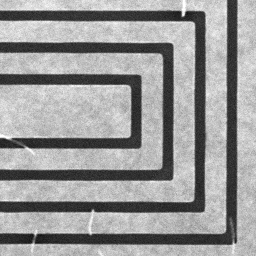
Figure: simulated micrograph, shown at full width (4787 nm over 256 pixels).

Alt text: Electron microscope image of groups of lines, slits or small figures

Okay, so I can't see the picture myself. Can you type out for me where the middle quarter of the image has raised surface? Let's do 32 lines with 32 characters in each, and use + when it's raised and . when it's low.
+++++++++++++++++++++++++...++++
+++++++++++++++++++++++++...++++
..................+++++++...++++
...................++++++...++++
....................+++++...++++
++++++++++++++++....+++++...++++
+++++++++++++++++...+++++...++++
+++++++++++++++++...+++++...++++
+++++++++++++++++...+++++...++++
+++++++++++++++++...+++++...++++
+++++++++++++++++..++++++...++++
+++++++++++++++++..++++++...++++
+++++++++++++++++..++++++...++++
+++++++++++++++++..++++++...++++
+++++++++++++++++..++++++...++++
+++++++++++++++++..++++++...++++
++++++++++++++++....+++++...++++
++++++++++++++++....+++++...++++
....................+++++...++++
....................+++++...++++
...................++++++...++++
+++++++++++++++++++++++++...++++
+++++++++++++++++++++++++...++++
+++++++++++++++++++++++++...++++
+++++++++++++++++++++++++...++++
+++++++++++++++++++++++++...++++
............................++++
............................++++
...........................+++++
++++++++++++++++++++++++++++++++
++++++++++++++++++++++++++++++++
++++++++++++++++++++++++++++++++